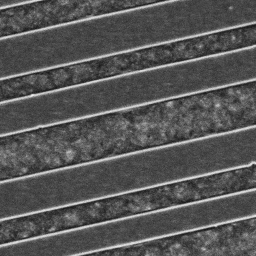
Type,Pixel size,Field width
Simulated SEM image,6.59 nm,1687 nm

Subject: one or a few lines or trenches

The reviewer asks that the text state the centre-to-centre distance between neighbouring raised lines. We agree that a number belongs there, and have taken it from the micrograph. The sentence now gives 443 nm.